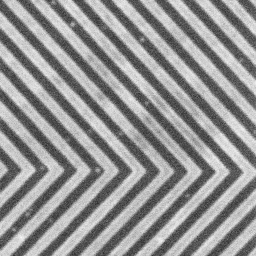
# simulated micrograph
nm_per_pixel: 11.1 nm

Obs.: groups of lines, slits or small figures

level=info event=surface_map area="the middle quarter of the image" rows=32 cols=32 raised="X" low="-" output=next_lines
XXX----XXX----XXX----XXX---XXX--
-XXX----XXX----XXX----XXX----XXX
--XXX----XXX----XXX----XXX---XXX
---XXX----XXX----XXX----XXX---XX
----XXX----XXX----XXX---XXXX---X
X----XXX----XXX---XXXX---XXX----
XX----XXX----XX----XXX----XXX---
XXX---XXXX---XXX----XXX----XXX--
-XXX---XXXX---XXX----XXX----XXX-
--XXX---XXXX---XXX----XXX----XXX
--XXXX---XXX----XXX----XXX----XX
---XXXX---XXX----XXX----XXX----X
----XXX----XXX----XXX----XXX----
XX---XXX----XXX----XXX----XXX---
XX----XXX----XXX----XXX----XXX--
XXX----XXX----XXX----XXX----XXX-
-XXX----XXX----XXX----XXX----XXX
--XXX----XXX----XXX----XXX---XXX
---XXX----XXX----XXX----XXX----X
----XXX----XXX----XXX----XX-----
X----XXX----XXX----XXX----XX----
XX----XXX----XXX----XXX---XXX---
XXX----XXX----XXX---XXX----XXX--
-XXX----XXX----XX----XXX----XXX-
--XXX----XXX---XXX----XXX----XXX
---XX----XXX----XXX----XXX----XX
---XXX----XXX----XXX----XXX----X
---XXX----XXX----XXX----XXX----X
--XXX----XXX----XXX----XXX----XX
-XXX----XXX----XXX----XXX----XXX
XXX----XXX----XXX----XXX----XXX-
XX----XXX----XXX----XXX----XXX--